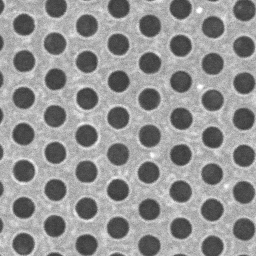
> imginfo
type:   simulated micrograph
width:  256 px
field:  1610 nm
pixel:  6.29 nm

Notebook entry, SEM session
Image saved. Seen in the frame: a regular array of holes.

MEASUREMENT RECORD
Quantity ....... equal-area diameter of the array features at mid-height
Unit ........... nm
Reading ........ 146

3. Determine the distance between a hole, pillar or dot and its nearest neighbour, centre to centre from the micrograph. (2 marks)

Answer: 227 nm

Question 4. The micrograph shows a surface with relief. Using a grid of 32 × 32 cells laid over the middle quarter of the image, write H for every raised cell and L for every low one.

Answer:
HHHLLLLLHHHHHHHHHHHLLLLLHHHHHHHH
HHHHLLLLHHHHHLHHHHHLLLLLHHHHHHHH
HHHHHHHHHHHHLLLLHHHHHLHHHHHLLLLH
LHHHHHHHHHHLLLLLHHHHHHHHHHLLLLLL
LHHHHHHHHHHLLLLLLHHHHHHHHHLLLLLL
HHHHHHHHHHHLLLLLHHHHHHHHHHHLLLLL
HHHHLLLLHHHHLLLHHHHHLLLHHHHLLLLH
HHHLLLLLHHHHHHHHHHHLLLLLHHHHHHHH
HHHLLLLLLHHHHHHHHHLLLLLLHHHHHHHH
HHHLLLLLLHHHHHHHHHLLLLLLHHHHHHHH
HHHHLLLLHHHHHLHHHHHLLLLLHHHHHHHH
HHHHHLHHHHHLLLLLHHHHLLHHHHHLLLLH
LHHHHHHHHHHLLLLLHHHHHHHHHHHLLLLL
LHHHHHHHHHHLLLLLHHHHHHHHHHLLLLLL
HHHHHHHHHHHLLLLLHHHHHHHHHHLLLLLL
HHHHLLLHHHHHLLLLHHHHLLLHHHHLLLLL
HHHLLLLLHHHHHHHHHHHLLLLLHHHHHLLH
HHHLLLLLHHHHHHHHHHHLLLLLHHHHHHHH
HHHLLLLLLHHHHHHHHHHLLLLLHHHHHHHH
HHHLLLLLHHHHHHHHHHHLLLLLHHHHHHHH
HHHHLLLHHHHLLLLLHHHHLLLHHHHLLLLH
LHHHHHHHHHHLLLLLHHHHHHHHHHHLLLLL
LHHHHHHHHHHLLLLLHHHHHHHHHHLLLLLL
HHHHHHHHHHHLLLLLHHHHHHHHHHHLLLLL
HHHHLLLHHHHLLLLLHHHHLLHHHHHLLLLH
HHHLLLLLHHHHHLHHHHHLLLLLHHHHLLHH
HHHLLLLLLHHHHHHHHHLLLLLLHHHHHHHH
HHHLLLLLHHHHHHHHHHLLLLLLHHHHHHHH
HHHLLLLLHHHHHHHHHHHLLLLLHHHHHHHH
HHHHLLLHHHHLLLLLHHHLLLLHHHHLLLLH
LHHHHHHHHHHLLLLLHHHHHHHHHHHLLLLL
LHHHHHHHHHLLLLLLHHHHHHHHHHLLLLLL